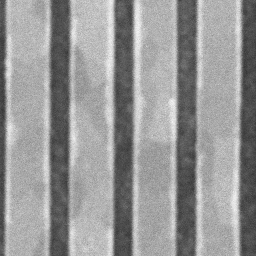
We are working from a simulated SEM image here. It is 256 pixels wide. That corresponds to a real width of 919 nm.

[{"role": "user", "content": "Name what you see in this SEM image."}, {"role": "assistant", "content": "one or a few lines or trenches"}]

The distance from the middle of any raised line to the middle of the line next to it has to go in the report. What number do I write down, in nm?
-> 228